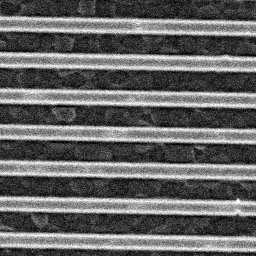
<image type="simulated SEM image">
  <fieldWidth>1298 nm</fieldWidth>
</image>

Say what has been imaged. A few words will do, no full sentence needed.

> parallel lines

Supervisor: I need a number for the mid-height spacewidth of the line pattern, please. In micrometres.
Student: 0.118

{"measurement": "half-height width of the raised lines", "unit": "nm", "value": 63.9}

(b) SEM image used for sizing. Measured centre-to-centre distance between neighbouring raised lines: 182 nm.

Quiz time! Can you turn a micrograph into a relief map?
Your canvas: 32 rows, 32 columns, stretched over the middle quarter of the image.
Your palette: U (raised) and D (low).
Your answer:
UUUUUUUUUUUUUUUUUUUUUUUUUUUUUUUU
DDDDDDDDDDDDDDDDDDDDDDDDDDDDDDDD
DDDDDDDDDDDDDDDDDDDDDDDDDDDDDDDD
DDDDDDDDDDDDDDDDDDDDDDDDDDDDDDDD
DDDDDDDDDDDDDDDDDDDDDDDDDDDDDDDD
DDDDDDDDDDDDDDDDDDDDDDDDDDDDDDDD
DDDDDDDDDDDDDDDDDDDDDDDDDDDDDDDD
UUUUUUUUUUUUUUUUUUUUUUUUUUUUUUUU
UUUUUUUUUUUUUUUUUUUUUUUUUUUUUUUU
UUUUUUUUUUUUUUUUUUUUUUUUUUUUUUUU
DDDDDDDDDDDDDDDDDDDDDDDDDDDDDDDD
DDDDDDDDDDDDDDDDDDDDDDDDDDDDDDDD
DDDDDDDDDDDDDDDDDDDDDDDDDDDDDDDD
DDDDDDDDDDDDDDDDDDDDDDDDDDDDDDDD
DDDDDDDDDDDDDDDDDDDDDDDDDDDDDDDD
DDDDDDDDDDDDDDDDDDDDDDDDDDDDDDDD
UUUUUUUUUUUUUUUUUUUUUUUUUUUUUUUU
UUUUUUUUUUUUUUUUUUUUUUUUUUUUUUUU
UUUUUUUUUUUUUUUUUUUUUUUUUUUUUUUU
DDDDDDDDDDDDDDDDDDDDDDDDDDDDDDDD
DDDDDDDDDDDDDDDDDDDDDDDDDDDDDDDD
DDDDDDDDDDDDDDDDDDDDDDDDDDDDDDDD
DDDDDDDDDDDDDDDDDDDDDDDDDDDDDDDD
DDDDDDDDDDDDDDDDDDDDDDDDDDDDDDDD
DDDDDDDDDDDDDDDDDDDDDDDDDDDDDDDD
UUUUUUUUUUUUUUUUUUUUUUUUUUUUUUUU
UUUUUUUUUUUUUUUUUUUUUUUUUUUUUUUU
UUUUUUUUUUUUUUUUUUUUUUUUUUUUUUUU
DDDDDDDDDDDDDDDDDDDDDDDDDDDDDDDD
DDDDDDDDDDDDDDDDDDDDDDDDDDDDDDDD
DDDDDDDDDDDDDDDDDDDDDDDDDDDDDDDD
DDDDDDDDDDDDDDDDDDDDDDDDDDDDDDDD